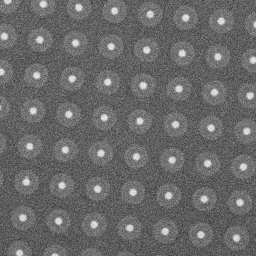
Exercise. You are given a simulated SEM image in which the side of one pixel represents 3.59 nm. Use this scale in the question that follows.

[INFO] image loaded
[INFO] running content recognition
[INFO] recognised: an array of small figures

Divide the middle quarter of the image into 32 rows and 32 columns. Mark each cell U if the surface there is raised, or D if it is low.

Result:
DDDDDDDDDDDDDDDDDDDDDDDDDDDDDDDD
UUUUDDDDDDDDDDDDDDDDDDDDDDDDDDDD
UUUUUDDDDUUUUDDDDDDUUDDDDDDDDDDD
UUUUUDDDUUUUUUDDDUUUUUDDDDDUUUDD
UUUUUDDDUUUUUUDDDUUUUUUDDDUUUUUD
UUUUDDDDUUUUUUDDDUUUUUUDDDUUUUUU
DUUDDDDDDUUUUDDDDUUUUUUDDDUUUUUU
DDDDDDDDDDDDDDDDDDUUUUDDDDUUUUUU
DDDDDDDDDDDDDDDDDDDDDDDDDDDUUUUD
DDDDDDDDDDDDDDDDDDDDDDDDDDDDDDDD
UUUDDDDDDDDDDDDDDDDDDDDDDDDDDDDD
UUUUDDDDUUUUDDDDDDUUDDDDDDDDDDDD
UUUUDDDUUUUUUDDDDUUUUDDDDDUUUDDD
UUUUDDDUUUUUUDDDUUUUUUDDDUUUUUDD
UUUUDDDUUUUUUDDDUUUUUUDDDUUUUUUD
UDDDDDDDUUUUDDDDUUUUUUDDDUUUUUUD
DDDDDDDDDDDDDDDDDUUUUDDDDUUUUUUD
DDDDDDDDDDDDDDDDDDDDDDDDDDUUUUDD
DDDDDDDDDDDDDDDDDDDDDDDDDDDDDDDD
UUUDDDDDUUDDDDDDDDDDDDDDDDDDDDDD
UUUDDDDUUUUUDDDDDUUDDDDDDDDDDDDD
UUUDDDUUUUUUDDDDUUUUUDDDDDUUUDDD
UUUDDDUUUUUUDDDUUUUUUDDDDUUUUUDD
UUUDDDUUUUUUDDDUUUUUUDDDUUUUUUDD
DDDDDDDUUUUDDDDUUUUUUDDDUUUUUUDD
DDDDDDDDDDDDDDDDUUUUDDDDUUUUUUDD
DDDDDDDDDDDDDDDDDDDDDDDDDUUUUDDD
DDDDDDDDDDDDDDDDDDDDDDDDDDDDDDDD
UUDDDDDUUDDDDDDDDDDDDDDDDDDDDDDD
UUDDDDUUUUUDDDDDUUUDDDDDDDDDDDDD
UUDDDDUUUUUDDDDUUUUUDDDDUUUUDDDD
UUDDDUUUUUUDDDUUUUUUDDDDUUUUUDDD